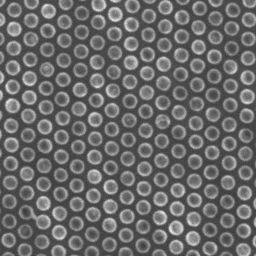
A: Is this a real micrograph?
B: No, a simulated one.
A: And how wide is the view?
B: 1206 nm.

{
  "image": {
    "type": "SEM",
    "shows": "a regular array of raised bodies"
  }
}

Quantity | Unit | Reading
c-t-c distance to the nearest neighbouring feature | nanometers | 88.3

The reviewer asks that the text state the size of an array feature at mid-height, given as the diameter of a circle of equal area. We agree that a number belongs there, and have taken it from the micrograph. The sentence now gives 13.3 px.